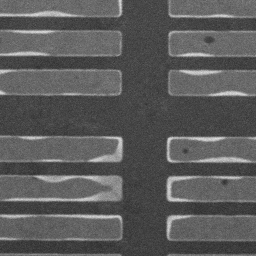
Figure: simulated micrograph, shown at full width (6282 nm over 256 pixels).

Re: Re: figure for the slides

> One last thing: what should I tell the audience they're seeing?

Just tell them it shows groups of lines, slits or small figures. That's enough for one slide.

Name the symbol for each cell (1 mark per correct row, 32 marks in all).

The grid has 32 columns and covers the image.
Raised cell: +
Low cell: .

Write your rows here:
+++++++++++++++......+++++++++++
+++++++++++++++......+++++++++++
................................
................................
+++++++++++++++......+++++++++++
+++++++++++++++......+++++++++++
+++++++++++++++......+++++++++++
................................
................................
+++++++++++++++......+++++++++++
+++++++++++++++......+++++++++++
+++++++++++++++......+++++++++++
................................
................................
................................
................................
................................
+++++++++++++++......+++++++++++
+++++++++++++++......+++++++++++
+++++++++++++++......+++++++++++
................................
................................
+++++++++++++........+++++++++++
+++++++++++++++......+++++++++++
+++++++++++++........+++++++++++
................................
................................
+++++++++++++++......+++++++++++
+++++++++++++++......+++++++++++
+++++++++++++++......+++++++++++
................................
................................